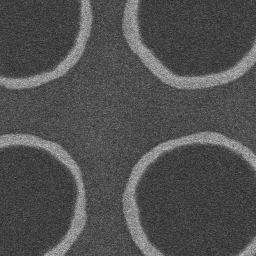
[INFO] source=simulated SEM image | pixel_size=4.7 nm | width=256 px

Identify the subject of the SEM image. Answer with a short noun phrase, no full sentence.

raised bodies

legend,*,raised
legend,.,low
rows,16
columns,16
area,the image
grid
*****...********
*****...********
*****...********
*****....*******
****......*****.
................
................
................
............*...
****......*****.
*****....*******
*****...********
*****...********
*****...********
*****...********
****.....*******